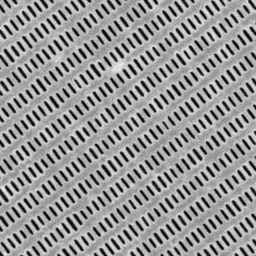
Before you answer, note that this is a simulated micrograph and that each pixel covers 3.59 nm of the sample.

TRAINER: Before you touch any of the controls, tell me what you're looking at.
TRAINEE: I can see a regular array of holes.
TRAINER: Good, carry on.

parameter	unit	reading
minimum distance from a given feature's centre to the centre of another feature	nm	26.3